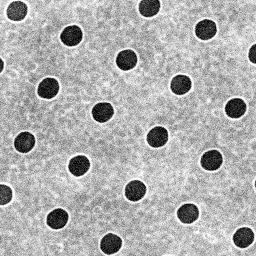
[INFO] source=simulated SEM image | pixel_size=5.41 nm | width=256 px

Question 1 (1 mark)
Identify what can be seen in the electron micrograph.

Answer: a regular array of holes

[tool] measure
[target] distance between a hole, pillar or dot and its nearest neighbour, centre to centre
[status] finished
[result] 311 nm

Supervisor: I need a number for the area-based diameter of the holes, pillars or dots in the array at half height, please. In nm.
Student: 121